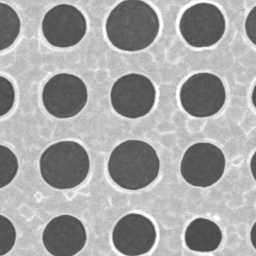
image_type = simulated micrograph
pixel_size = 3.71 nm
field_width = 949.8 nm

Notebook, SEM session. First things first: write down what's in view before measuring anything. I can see a regular array of holes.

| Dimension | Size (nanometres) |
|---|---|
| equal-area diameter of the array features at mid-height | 166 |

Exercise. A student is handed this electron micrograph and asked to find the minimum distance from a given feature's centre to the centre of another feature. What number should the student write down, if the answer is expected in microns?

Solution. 0.257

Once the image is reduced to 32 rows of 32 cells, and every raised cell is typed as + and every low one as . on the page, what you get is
.++++++++++++++...+++++++.++++++
..++++....++++.....++++.....+++.
..+++......++.......+++.....+++.
..+++......++.......+++.....+++.
..++++....++++......+++.....+++.
.+++++...+++++.....+++++...+++++
++++++++++++++++++++++++++++++++
++++++++++++++++++++++++++++++++
++++++++++++++++++++++++++++++++
+++++++..++++++...++++++...+++++
.+++++....++++.....++++.....++++
..+++......+++.....++++.....++++
..+++......+++.....++++.....++++
.+++++....++++.....++++.....++++
+++++++..++++++...++++++..++++++
++++++++++++++++++++++++++++++++
++++++++++++++++++++++++++++++++
++++++++++++++++++++++++++++++++
.+++++....++++.....+++++...+++++
..+++......+++......+++.....++++
..+++......+++......+++.....+++.
..+++......+++......+++.....+++.
.+++++....++++.....++++....+++++
+++++++..+++++++..++++++++++++++
++++++++++++++++++++++++++++++++
++++++++++++++++++++++++++++++++
++++++++++++++++++++++++++++++++
.+++++....+++++....+++++..++++++
..++++.....+++.....++++....++++.
..+++......+++.....++++.....+++.
..+++......+++.....++++....+++++
.+++++....+++++...+++++++.++++++